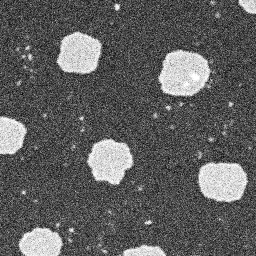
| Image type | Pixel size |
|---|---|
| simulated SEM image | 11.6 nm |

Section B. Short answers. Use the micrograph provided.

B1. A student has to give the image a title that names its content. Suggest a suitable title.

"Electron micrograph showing raised bodies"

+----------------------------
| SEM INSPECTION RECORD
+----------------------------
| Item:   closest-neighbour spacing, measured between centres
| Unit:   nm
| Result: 1260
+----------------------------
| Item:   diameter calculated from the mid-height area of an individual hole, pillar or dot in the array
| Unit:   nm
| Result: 493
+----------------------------